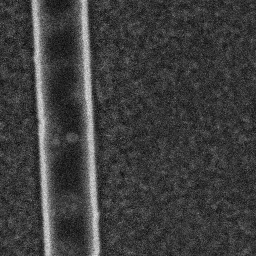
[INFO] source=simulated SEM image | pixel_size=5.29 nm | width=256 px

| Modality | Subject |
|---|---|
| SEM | one or a few lines or trenches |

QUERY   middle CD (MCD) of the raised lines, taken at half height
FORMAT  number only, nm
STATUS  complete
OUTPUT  267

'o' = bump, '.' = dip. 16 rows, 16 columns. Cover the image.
..ooo...........
..ooo...........
..ooo...........
..ooo...........
..oooo..........
..oooo..........
..oooo..........
...ooo..........
...ooo..........
...ooo..........
...ooo..........
...ooo..........
...ooo..........
...ooo..........
...ooo..........
...ooo..........